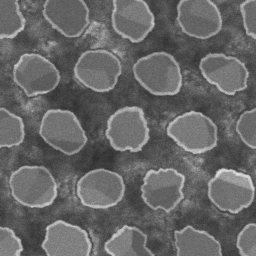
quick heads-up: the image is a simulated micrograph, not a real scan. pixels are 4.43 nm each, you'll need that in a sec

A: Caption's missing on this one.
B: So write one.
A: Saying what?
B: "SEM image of a regular array of raised bodies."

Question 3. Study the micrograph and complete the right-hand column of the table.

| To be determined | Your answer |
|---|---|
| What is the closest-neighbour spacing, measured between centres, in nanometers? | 276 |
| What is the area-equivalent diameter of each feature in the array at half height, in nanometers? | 187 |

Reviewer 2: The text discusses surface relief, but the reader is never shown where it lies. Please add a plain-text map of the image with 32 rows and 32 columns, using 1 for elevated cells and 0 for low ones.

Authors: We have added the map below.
11000011111000111100001111100001
11000011111000111110001111100011
11100011111000111110001111110001
11100001111000111110000111100001
10000000000000001100000011000000
00000000000000000000000000000000
00000000000010000000000000000000
00011100001111100111110001111100
00111110001111100111110001111110
00111110001111100111111000111110
00111110000111000011111000011110
00011100000000000001110000001000
00000000000000000000000000000000
00000000000000000000000000000000
11000011100000111100000110000011
11100111110000111100011111100011
11100111110001111100011111100011
11100011111000111100001111100011
00000001110000011000000111000000
00000000000000000000000000000000
00000000000000000000000000000000
00111100000111000001110000001000
01111110001111100011111000011110
01111110001111100011111000111111
00111110001111100011111000111111
00011100000111000001110000011110
00000000000000000000000000000000
00000000000000000000000000000000
00000011110000011000000100000001
11000011111000111100001111000011
11100111111001111100001111100011
11000011111000111110001111110011